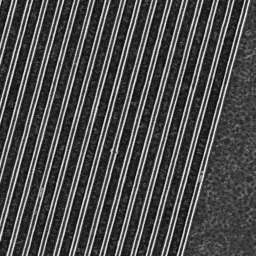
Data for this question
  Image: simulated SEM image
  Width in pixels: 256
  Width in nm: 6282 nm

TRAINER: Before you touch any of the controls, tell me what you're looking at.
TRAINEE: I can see parallel lines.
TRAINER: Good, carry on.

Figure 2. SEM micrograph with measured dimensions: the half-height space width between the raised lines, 261 nm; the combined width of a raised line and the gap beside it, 15 pixels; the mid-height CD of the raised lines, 3.87 px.